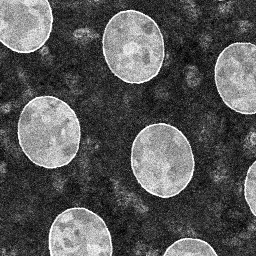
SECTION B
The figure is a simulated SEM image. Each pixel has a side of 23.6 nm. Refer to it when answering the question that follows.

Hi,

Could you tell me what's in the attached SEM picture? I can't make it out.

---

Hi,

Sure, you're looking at raised bodies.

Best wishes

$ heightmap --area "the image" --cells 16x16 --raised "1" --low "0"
1110000000000000
1110000111000000
1110001111000000
0000000111000011
0000000111000111
0000000000000011
0011000000000011
0111100000000000
0111100001100000
0011100011110000
0000000011110000
0000000001110001
0000000000000001
0000110000000000
0001111000000000
0001111000011000